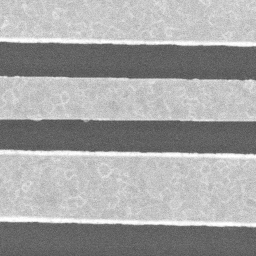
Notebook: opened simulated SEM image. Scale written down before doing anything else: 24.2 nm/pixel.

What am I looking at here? lines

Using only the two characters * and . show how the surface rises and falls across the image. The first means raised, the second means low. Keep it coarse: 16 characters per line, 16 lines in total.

****************
****************
****************
................
................
****************
****************
...........*****
................
**..............
****************
****************
****************
****************
................
................